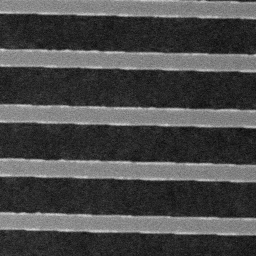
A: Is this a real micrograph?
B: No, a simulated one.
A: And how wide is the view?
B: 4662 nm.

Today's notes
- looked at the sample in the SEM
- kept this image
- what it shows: lines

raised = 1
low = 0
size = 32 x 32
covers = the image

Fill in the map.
11111111111111111111111111111111
11111111111111111111111111111111
00000000000000000000000000000000
00000000000000000000000000000000
00000000000000000000000000000000
00000000000000000000000000000000
11111111111110000000000000000000
11111111111111111111111111111111
00000000000000011111111111111111
00000000000000000000000000000000
00000000000000000000000000000000
00000000000000000000000000000000
00000000000000000000000000000000
11111111111111111111000000000000
11111111111111111111111111111111
00000000000001111111111111111111
00000000000000000000000000000000
00000000000000000000000000000000
00000000000000000000000000000000
00000000000000000000000000000000
11111111111111111111111111100000
11111111111111111111111111111111
00000000000000000000000011111111
00000000000000000000000000000000
00000000000000000000000000000000
00000000000000000000000000000000
00000000000000000000000000000000
11111111111111111111111111111111
11111111111111111111111111111111
00000000000000000000000000000000
00000000000000000000000000000000
00000000000000000000000000000000